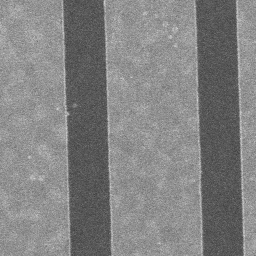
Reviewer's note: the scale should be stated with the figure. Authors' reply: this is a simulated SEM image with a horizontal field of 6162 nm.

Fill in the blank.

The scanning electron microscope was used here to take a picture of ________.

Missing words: one or a few lines or trenches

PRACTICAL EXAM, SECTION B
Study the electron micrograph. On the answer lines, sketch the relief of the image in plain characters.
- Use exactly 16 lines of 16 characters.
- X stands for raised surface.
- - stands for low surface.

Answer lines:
XXXX---XXXXX---X
XXXX---XXXXX---X
XXXX---XXXXX---X
XXXX---XXXXX---X
XXXX---XXXXX---X
XXXX---XXXXX---X
XXXX---XXXXX---X
XXXX---XXXXX---X
XXXX---XXXXX---X
XXXX---XXXXX---X
XXXX---XXXXXX--X
XXXX---XXXXX---X
XXXX---XXXXXX--X
XXXX---XXXXXX--X
XXXX---XXXXXX--X
XXXX---XXXXXX--X